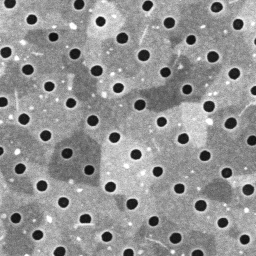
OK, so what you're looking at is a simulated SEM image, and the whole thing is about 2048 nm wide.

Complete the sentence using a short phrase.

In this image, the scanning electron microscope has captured a regular array of holes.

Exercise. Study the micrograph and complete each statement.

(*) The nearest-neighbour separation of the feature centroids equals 219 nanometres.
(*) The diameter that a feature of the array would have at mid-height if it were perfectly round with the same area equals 91.8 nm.